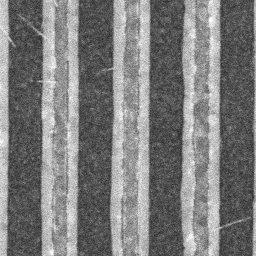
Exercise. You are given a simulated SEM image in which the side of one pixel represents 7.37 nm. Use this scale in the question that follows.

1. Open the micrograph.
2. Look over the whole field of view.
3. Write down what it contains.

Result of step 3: one or a few lines or trenches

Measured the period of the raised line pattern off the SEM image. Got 518 nanometres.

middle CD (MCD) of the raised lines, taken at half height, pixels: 27.1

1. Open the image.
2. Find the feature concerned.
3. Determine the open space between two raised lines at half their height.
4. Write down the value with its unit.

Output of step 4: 317 nm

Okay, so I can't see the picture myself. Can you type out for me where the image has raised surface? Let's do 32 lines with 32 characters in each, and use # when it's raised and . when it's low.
......###......###......###.....
......###......###......###.....
......###......###......###.....
#.....###......###......###.....
......###......###......###.....
......###......###.....####.....
......###......###.....####.....
......###......###......###.....
......###......###......###.....
......###......###......###.....
......###......###......###.....
......###......###......###.....
......###......###......###.....
......###......###......###.....
......###......###.....####.....
......###......###.....####.....
......###......###.....####.....
......###......###.....####.....
......###......###.....####.....
......###.....####.....####.....
......###.....####.....####.....
......###......###.....####.....
......###......###.....####.....
......###......###.....####.....
......###.....####.....####.....
......###.....####.....####.....
......###.....####.....####.....
......###.....####.....####.....
......###.....####.....####.....
......###......###.....####.....
......###......###......###.....
......###......###......###.....